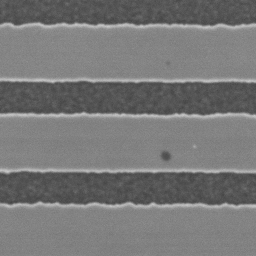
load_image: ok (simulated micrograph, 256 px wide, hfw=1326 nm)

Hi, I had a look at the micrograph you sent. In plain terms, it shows lines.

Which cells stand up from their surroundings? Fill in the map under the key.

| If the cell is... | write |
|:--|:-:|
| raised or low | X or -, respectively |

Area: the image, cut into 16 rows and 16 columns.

----------------
X-X-------------
XXXXXXXXXXXXXXXX
XXXXXXXXXXXXXXXX
XXXXXXXXXXXXXXXX
----------------
----------------
XXXXXXXXXXXXXXXX
XXXXXXXXXXXXXXXX
XXXXXXXXXXXXXXXX
XXXXXXXXXXXXXXXX
----------------
----------------
XXXXXXXXXXXXXXXX
XXXXXXXXXXXXXXXX
XXXXXXXXXXXXXXXX